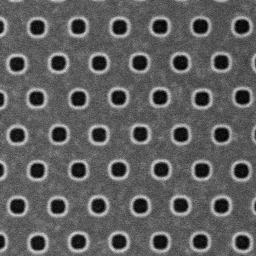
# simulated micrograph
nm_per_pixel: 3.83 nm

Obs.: a regular array of holes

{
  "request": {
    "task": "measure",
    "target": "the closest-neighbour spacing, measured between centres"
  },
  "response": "0.155 micrometres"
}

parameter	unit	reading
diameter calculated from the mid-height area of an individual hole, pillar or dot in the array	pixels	17.1